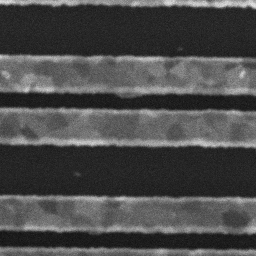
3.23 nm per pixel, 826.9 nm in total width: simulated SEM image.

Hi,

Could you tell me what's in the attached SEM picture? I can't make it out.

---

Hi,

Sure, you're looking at lines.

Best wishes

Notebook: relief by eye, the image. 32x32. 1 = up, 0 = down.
00000000000000000000001011111111
00000000000000000000000000000000
00000000000000000000000000000000
00000000000000000000000000000000
00000000000000000000000000000000
00000000000000000000000000000000
00000000000000000000000000000000
11111111111111111111111111111111
11111111111111111111111111111111
11111111111111111111111111111111
11111111111111111111111111111111
00000000000000000000000001001101
00000000000000000000000000000000
00000000000000000000000000000000
11111111111111111111111111111111
11111111111111111111111111111111
11111111111111111111111111111111
11111111111111111111111111111111
00000000000000000000000000000000
00000000000000000000000000000000
00000000000000000000000000000000
00000000000000000000000000000000
00000000000000000000000000000000
00000000000000000000000000000000
00000000000000000000000000000000
11111111111111111111111111111111
11111111111111111111111111111111
11111111111111111111111111111111
11111111111111111111111111111111
00000000000000000000000000000000
00000000000000000000000000000000
11111111111111111111111111111111